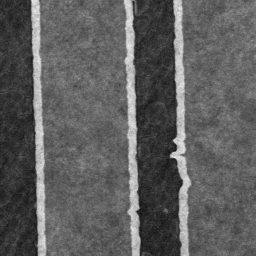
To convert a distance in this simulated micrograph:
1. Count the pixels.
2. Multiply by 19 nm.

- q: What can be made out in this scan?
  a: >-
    one or a few lines or trenches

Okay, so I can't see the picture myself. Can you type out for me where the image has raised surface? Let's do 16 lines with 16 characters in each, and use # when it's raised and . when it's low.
..######...#####
..######...#####
..######...#####
..######...#####
..######...#####
..######...#####
..######...#####
..######...#####
..######...#####
...#####...#####
...#####...#####
...#####....####
...#####...#####
...#####...#####
...#####....####
...#####....####